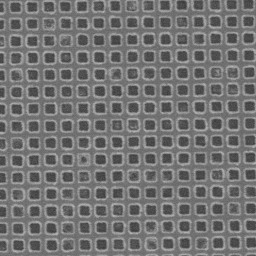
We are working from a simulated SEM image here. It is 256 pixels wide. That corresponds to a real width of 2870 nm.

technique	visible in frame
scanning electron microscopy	a regular array of holes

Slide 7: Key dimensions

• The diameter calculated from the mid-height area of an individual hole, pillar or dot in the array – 141 nm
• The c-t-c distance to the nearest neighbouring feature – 0.184 um